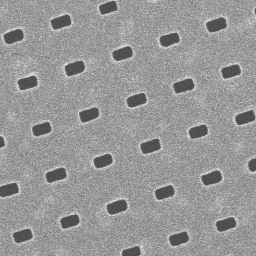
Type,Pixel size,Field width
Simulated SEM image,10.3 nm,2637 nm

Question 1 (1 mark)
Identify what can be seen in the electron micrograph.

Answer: a regular array of holes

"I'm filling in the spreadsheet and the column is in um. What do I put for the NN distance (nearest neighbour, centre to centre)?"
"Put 0.497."